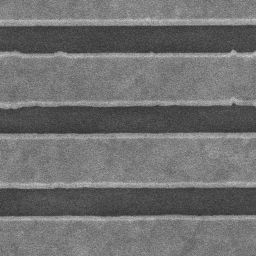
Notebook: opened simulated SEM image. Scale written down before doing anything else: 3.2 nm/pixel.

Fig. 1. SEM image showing one or a few lines or trenches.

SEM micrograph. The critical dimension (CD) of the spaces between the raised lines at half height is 31.9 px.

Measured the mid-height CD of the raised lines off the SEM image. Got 159 nm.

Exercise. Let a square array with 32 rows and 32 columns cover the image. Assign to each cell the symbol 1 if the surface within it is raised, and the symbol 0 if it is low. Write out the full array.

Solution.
11111111111111111111111111111111
11111111111111111111111111111111
11111111111111111111111111111111
00000000000000000000000000000000
00000000000000000000000000000000
00000000000000000000000000000000
00000000000000000000000000000000
11111111111111111111111111111111
11111111111111111111111111111111
11111111111111111111111111111111
11111111111111111111111111111111
11111111111111111111111111111111
11111111111111111111111111111111
00000000000000000000000000000000
00000000000000000000000000000000
00000000000000000000000000000000
00000000000000000000000000000000
11111111111111111111111111111111
11111111111111111111111111111111
11111111111111111111111111111111
11111111111111111111111111111111
11111111111111111111111111111111
11111111111111111111111111111111
00000000000000000000000000000000
00000000000000000000000000000000
00000000000000000000000000000000
00000000000000000000000000000000
11111111111111111111111111111111
11111111111111111111111111111111
11111111111111111111111111111111
11111111111111111111111111111111
11111111111111111111111111111111